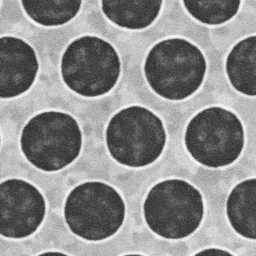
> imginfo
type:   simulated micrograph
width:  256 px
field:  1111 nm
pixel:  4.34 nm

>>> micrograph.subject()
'holes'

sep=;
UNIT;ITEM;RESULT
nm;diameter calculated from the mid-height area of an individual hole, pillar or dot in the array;270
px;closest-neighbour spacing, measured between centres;79.4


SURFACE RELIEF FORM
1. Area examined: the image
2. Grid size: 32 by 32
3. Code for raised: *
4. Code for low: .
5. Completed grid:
***.......***.......***.......**
***.......***.......***.......**
****.....*****.....*****.....***
***************...**************
..********..*******************.
....*****.....*****.....*****...
....****.......***.......****...
.....***.......***........**....
.....***.......***........**....
.....***.......***........**....
....****.......***.......****...
...******.....*****......*****..
*********************..*********
***************...********..****
****.....*****......****......**
***.......***.......***.......**
***.......***........**........*
**........***........**........*
***.......***........**.......**
***.......****......****......**
****.....******....******....***
******.*************************
*..*****************...********.
.....****.....*****......****...
.....***.......***.......***....
......**........**........**....
......**........**........**....
......**........**.......***....
.....****......****......****...
....******....******....******..
********************************
*****...*****************....***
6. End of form